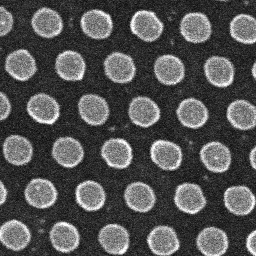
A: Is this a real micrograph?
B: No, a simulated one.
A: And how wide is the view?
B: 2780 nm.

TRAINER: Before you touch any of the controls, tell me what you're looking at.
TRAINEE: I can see a regular array of raised bodies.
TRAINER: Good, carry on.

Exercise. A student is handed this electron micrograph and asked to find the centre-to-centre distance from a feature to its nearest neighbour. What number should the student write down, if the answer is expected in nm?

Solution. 532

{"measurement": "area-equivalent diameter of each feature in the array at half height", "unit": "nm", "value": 321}